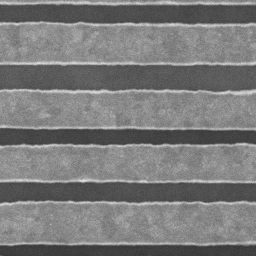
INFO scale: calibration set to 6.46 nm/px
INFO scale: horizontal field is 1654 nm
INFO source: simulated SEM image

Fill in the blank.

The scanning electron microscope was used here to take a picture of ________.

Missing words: lines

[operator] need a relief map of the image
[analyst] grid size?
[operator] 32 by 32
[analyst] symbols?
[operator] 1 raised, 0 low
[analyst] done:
01100000000111110111011101101110
00000000000000000000000000000000
00000000000000000000000000000000
11111111111111111111111111111111
11111111111111111111111111111111
11111111111111111111111111111111
11111111111111111111111111111111
11111111111111111111111111111111
00000000000000000000000000000000
00000000000000000000000000000000
00000000000000000000000000000000
11111111111111111111111111001011
11111111111111111111111111111111
11111111111111111111111111111111
11111111111111111111111111111111
11111111111111111111111111111111
00000000000000000000000000000000
00000000000000000000000000000000
11111111111111111111111111111111
11111111111111111111111111111111
11111111111111111111111111111111
11111111111111111111111111111111
11111111111111111111111111111111
00000000000000000000000000000000
00000000000000000000000000000000
11111111111111111111111111111111
11111111111111111111111111111111
11111111111111111111111111111111
11111111111111111111111111111111
11111111111111111111111111111111
11100001111111111111011111110111
00000000000000000000000000000000